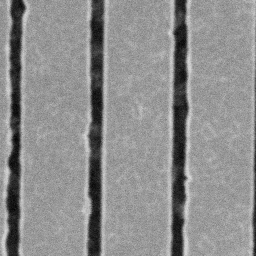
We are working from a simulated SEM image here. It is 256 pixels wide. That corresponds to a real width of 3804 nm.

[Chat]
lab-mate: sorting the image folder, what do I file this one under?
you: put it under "one or a few lines or trenches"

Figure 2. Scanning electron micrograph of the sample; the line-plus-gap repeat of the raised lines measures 82.6 pixels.